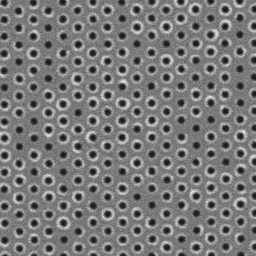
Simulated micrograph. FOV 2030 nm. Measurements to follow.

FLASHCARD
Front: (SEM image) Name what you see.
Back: a regular array of holes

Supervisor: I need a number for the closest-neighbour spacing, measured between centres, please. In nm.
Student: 132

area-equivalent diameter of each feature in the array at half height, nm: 57.3